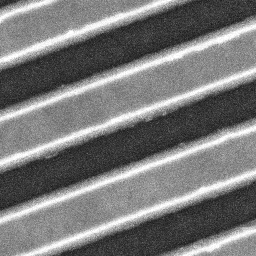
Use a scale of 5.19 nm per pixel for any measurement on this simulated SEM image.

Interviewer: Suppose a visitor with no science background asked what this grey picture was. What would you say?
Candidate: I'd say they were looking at one or a few lines or trenches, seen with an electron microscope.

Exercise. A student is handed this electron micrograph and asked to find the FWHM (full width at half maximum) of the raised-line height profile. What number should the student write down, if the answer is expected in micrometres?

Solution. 0.216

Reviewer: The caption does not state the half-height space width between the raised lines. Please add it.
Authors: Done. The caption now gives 0.279 micrometres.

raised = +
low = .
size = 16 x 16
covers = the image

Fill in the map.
..+++++++.......
++++++..........
++++..........++
+..........+++++
........++++++++
.....++++++++...
...+++++++......
+++++++.........
+++++.........++
++..........++++
.........+++++++
......++++++++..
....+++++++.....
.+++++++........
++++++..........
+++..........+++